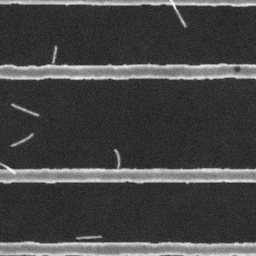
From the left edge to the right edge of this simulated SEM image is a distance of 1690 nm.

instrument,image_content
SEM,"lines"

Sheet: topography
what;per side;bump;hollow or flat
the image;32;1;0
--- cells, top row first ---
00000000000010111101011111111111
00000000000000000000000000000000
00000000000000000000000000000000
00000000000000000000000000000000
00000000000000000000000000000000
00000000000000000000000000000000
00000000000000000000000000000000
00000000000000000000000000000000
11111111111111111111111111111111
11111111111111111111111111111111
00000000000000000000000000000000
00000000000000000000000000000000
00000000000000000000000000000000
00000000000000000000000000000000
00000000000000000000000000000000
00000000000000000000000000000000
00000000000000000000000000000000
00000000000000000000000000000000
00000000000000000000000000000000
00000000000000000000000000000000
00000000000000000000000000000000
11111111111111111111111111111111
11111111111111111111111111111111
00000000000000000000000000000000
00000000000000000000000000000000
00000000000000000000000000000000
00000000000000000000000000000000
00000000000000000000000000000000
00000000000000000000000000000000
00000000000000000000000000000000
11111000111111111110110000000000
11111111111111111111111111111111